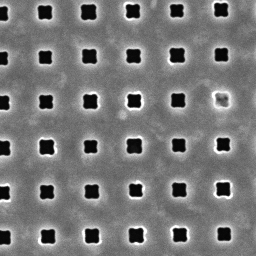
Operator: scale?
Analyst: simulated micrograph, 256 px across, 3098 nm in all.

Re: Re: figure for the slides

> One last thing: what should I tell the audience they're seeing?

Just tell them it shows a regular array of holes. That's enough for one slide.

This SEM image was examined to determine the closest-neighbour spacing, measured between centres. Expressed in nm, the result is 532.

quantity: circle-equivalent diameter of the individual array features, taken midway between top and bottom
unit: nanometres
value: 191